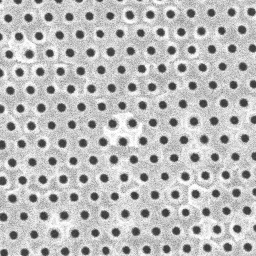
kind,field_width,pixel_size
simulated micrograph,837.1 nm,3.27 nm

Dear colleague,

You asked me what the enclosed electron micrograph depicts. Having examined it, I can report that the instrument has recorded a regular array of holes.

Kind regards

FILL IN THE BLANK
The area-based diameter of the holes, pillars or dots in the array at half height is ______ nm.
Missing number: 27.4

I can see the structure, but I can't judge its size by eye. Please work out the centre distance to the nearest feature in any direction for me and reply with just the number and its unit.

65.6 nm